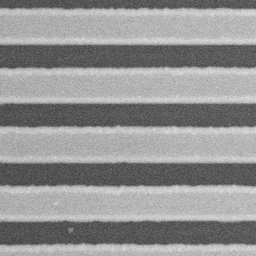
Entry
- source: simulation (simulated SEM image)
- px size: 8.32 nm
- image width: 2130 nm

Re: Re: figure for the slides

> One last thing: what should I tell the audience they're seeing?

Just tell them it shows lines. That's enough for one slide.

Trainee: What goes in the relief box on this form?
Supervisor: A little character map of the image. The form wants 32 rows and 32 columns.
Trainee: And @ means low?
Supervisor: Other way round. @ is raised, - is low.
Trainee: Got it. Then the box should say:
--------------------------------
@@@@@@@@@@@@@@@@@@@@@@@@@@@@@@@@
@@@@@@@@@@@@@@@@@@@@@@@@@@@@@@@@
@@@@@@@@@@@@@@@@@@@@@@@@@@@@@@@@
@@@@@@@@@@@@@@@@@@@@@@@@@@@@@@@@
--------------------------------
--------------------------------
--------------------------------
--------------------------------
@@@@@@@@@@@@@@@@@@@@@@@@@@@@@@@@
@@@@@@@@@@@@@@@@@@@@@@@@@@@@@@@@
@@@@@@@@@@@@@@@@@@@@@@@@@@@@@@@@
@@@@@@@@@@@@@@@@@@@@@@@@@@@@@@@@
--------------------------------
--------------------------------
--------------------------------
@@@@@@@@@@@@@@@@@@@@@@@@@@@@@@@@
@@@@@@@@@@@@@@@@@@@@@@@@@@@@@@@@
@@@@@@@@@@@@@@@@@@@@@@@@@@@@@@@@
@@@@@@@@@@@@@@@@@@@@@@@@@@@@@@@@
--------------------------------
--------------------------------
--------------------------------
@@@@@@@@@@@@@@@@@@@@@@@@@@@@@@@@
@@@@@@@@@@@@@@@@@@@@@@@@@@@@@@@@
@@@@@@@@@@@@@@@@@@@@@@@@@@@@@@@@
@@@@@@@@@@@@@@@@@@@@@@@@@@@@@@@@
-@@@--@--@@----@@@--------------
--------------------------------
--------------------------------
--------------------------------
@@@@@@@@@@@@@@@@@@@@@@@@@@@@@@@@